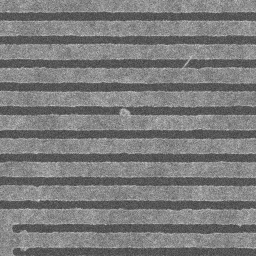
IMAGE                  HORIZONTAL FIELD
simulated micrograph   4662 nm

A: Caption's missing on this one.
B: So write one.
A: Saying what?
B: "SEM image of parallel lines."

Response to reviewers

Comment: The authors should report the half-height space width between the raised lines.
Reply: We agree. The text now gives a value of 166 nm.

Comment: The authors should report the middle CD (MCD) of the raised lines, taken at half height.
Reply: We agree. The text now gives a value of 260 nanometres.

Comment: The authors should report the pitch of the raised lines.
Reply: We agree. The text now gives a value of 429 nm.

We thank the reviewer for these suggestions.